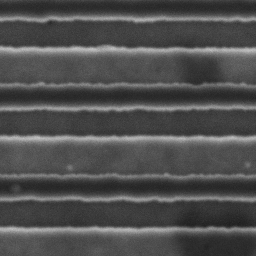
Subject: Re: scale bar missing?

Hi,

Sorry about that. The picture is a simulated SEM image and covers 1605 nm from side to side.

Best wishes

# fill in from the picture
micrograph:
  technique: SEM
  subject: lines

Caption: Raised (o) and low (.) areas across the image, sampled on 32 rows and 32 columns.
oooooooooooooooooooooooooooooooo
oooooooooooooooooooooooooooooooo
....oo...........o............o.
................................
................................
................................
oooooooooooooooooooooooooooooooo
oooooooooooooooooooooooooooooooo
oooooooooooooooooooooooooooooooo
oooooooooooooooooooooooooooooooo
oooooooooooooooooooooooooooooooo
oooooooooooooooooooooooooooooooo
oooooooooooooooooooooooooooooooo
ooooooooooooooooo.oooooooo..o.oo
................................
................................
................................
oooooooooooooooooooooooooooooooo
oooooooooooooooooooooooooooooooo
oooooooooooooooooooooooooooooooo
oooooooooooooooooooooooooooooooo
oooooooooooooooooooooooooooooooo
oooooooooooooooooooooooooooooooo
oooooooooooooooooooooooooooooooo
oooooooooooooooooooooooooooooooo
................................
................................
................................
................................
oooooooooooooooooooooooooooooooo
oooooooooooooooooooooooooooooooo
oooooooooooooooooooooooooooooooo